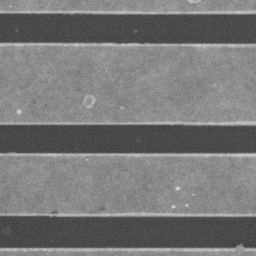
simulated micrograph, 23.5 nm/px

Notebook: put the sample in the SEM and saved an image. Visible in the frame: lines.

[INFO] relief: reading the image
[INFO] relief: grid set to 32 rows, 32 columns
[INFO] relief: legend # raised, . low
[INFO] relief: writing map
################################
################################
................................
................................
................................
###########..##..#..............
################################
################################
################################
################################
################################
################################
################################
################################
################################
################################
................................
................................
................................
################################
################################
################################
################################
################################
################################
################################
################################
................................
................................
................................
................................
################################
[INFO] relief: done